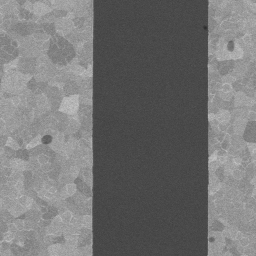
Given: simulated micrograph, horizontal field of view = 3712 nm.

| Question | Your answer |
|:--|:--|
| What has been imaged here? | one or a few lines or trenches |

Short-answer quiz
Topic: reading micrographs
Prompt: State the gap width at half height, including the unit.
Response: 1680 nm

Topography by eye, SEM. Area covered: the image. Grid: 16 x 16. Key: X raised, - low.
XXXXXX-------XXX
XXXXXX-------XXX
XXXXXX-------XXX
XXXXXX-------XXX
XXXXXX-------XXX
XXXXXX-------XXX
XXXXXX-------XXX
XXXXXX-------XXX
XXXXXX-------XXX
XXXXXX-------XXX
XXXXXX-------XXX
XXXXXX-------XXX
XXXXXX-------XXX
XXXXXX-------XXX
XXXXXX-------XXX
XXXXXX-------XXX